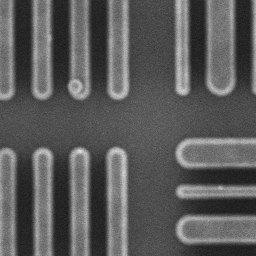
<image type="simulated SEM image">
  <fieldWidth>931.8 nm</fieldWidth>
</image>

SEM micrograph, groups of lines, slits or small figures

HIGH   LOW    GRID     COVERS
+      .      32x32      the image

++..++...++...++......+...+++...
++..++...++...++......+...+++...
++..++...++...++......+...+++...
++..++...++...++......+...+++...
++..++...++...++......+...+++...
++..++...++...++......+...+++...
++..++...++...++......+...+++...
++..++...++...++......++..+++...
++..++...++...++......++..+++...
++..++...++...++......++..+++...
++..++...++...++......+...+++...
++..++...++...++...........+....
................................
................................
................................
................................
................................
................................
......................++++++++++
++..++...++...++......++++++++++
++..++...++..+++.......+++++++++
++..++...++..+++................
++..++...++..+++................
++..++...++..+++.......+++++++++
++..++...++..+++.......+++++++++
++..++...++..+++................
++..++...++..+++................
++..++...++...++.......+++++++++
++..++...++...++......++++++++++
++..++...++...++......++++++++++
++..++...++...++................
++..+++..++...++................